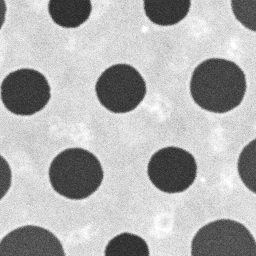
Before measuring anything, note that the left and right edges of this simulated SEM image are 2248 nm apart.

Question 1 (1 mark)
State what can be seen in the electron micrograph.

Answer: holes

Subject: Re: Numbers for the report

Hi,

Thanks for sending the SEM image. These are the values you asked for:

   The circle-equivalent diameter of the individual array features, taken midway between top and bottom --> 462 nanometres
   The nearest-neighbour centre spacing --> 96.1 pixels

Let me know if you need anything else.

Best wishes